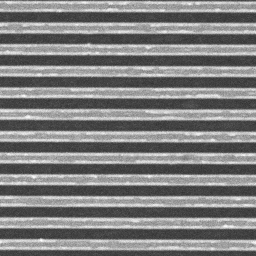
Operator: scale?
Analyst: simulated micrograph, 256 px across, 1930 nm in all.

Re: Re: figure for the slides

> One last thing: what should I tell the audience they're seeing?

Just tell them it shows parallel lines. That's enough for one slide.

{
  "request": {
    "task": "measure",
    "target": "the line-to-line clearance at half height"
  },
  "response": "86.7 nm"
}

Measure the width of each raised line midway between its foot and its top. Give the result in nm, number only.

79.1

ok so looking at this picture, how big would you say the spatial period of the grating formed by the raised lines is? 163 nm